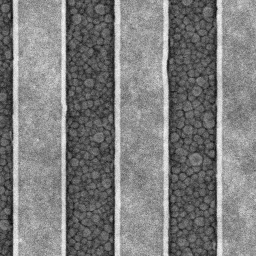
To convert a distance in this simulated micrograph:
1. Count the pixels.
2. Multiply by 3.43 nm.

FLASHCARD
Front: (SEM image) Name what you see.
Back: one or a few lines or trenches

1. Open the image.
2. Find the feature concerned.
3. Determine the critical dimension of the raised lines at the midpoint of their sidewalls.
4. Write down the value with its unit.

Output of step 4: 166 nanometres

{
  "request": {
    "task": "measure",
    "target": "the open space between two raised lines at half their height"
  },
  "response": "0.181 microns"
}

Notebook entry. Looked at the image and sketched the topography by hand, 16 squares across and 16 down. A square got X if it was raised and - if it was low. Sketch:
-XXX---XXX----XX
-XXX---XXX----XX
-XXX---XXX----XX
-XXX---XXX----XX
-XXX---XXX----XX
-XXX---XXX----XX
-XXX---XXX----XX
-XXX---XXX----XX
-XXX---XXX----XX
-XXX---XXX----XX
-XXX---XXX----XX
-XXX---XXX----XX
-XXX---XXX----XX
-XXX---XXX----XX
-XXX---XXX----XX
-XXX---XXX----XX